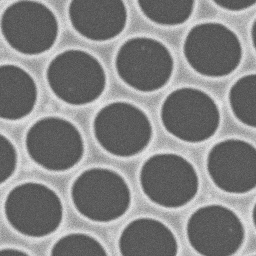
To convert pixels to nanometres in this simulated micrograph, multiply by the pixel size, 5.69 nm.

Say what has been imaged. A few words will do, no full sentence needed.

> a regular array of holes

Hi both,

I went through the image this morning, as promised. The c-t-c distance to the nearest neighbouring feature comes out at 391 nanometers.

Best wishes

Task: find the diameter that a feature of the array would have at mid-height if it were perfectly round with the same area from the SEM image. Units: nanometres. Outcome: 321